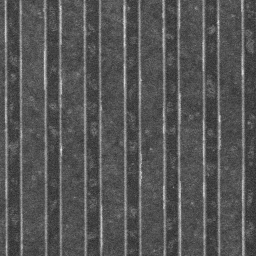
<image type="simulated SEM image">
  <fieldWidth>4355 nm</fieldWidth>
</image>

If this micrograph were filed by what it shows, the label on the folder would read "parallel lines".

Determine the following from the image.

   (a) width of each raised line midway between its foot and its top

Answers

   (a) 25.2 px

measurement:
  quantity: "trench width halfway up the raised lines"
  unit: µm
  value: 0.249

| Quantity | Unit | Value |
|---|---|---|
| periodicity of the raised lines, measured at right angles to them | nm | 672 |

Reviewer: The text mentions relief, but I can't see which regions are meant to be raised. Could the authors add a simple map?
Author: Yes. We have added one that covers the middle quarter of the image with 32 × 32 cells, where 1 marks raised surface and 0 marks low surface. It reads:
11111000011111100001111110000111
11111000011111100001111110000111
11111000011111100001111110000111
11111000011111100001111110000111
11111000011111100001111110000111
11111000011111100001111110000111
11111000011111100001111110000111
11111000011111100001111110000111
11111000011111100001111110000111
11111000011111100001111110000111
11111000011111100001111110000111
11111000011111100001111110000111
11111000011111100001111110000111
11111000011111100001111110000111
11111000011111100001111110000111
11111000011111100001111110000111
11111000011111100001111110000111
11111000011111100001111110000111
11111000011111100001111110000111
11111000011111100001111110000111
11111000011111100001111110000111
11111000011111100001111110000111
11111000011111100001111110000111
11111000011111100001111110000111
11111000011111100001111110000111
11111000011111100001111110000111
11111000011111100001111110000111
11111000011111100001111110000111
11111000011111100001111110000111
11111000011111100001111110000111
11111000011111100001111110000111
11111000011111100001111110000111